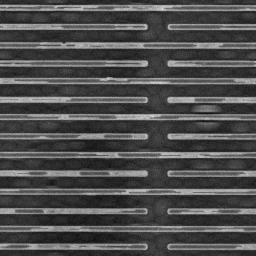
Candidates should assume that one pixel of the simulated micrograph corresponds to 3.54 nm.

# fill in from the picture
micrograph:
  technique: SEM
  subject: parallel lines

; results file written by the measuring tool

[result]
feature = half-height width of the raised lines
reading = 18.1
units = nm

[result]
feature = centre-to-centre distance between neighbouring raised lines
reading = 65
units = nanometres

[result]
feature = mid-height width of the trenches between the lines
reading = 0.0456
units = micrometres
